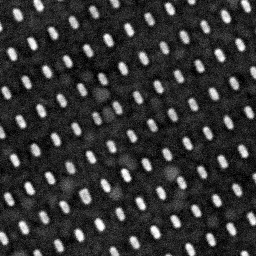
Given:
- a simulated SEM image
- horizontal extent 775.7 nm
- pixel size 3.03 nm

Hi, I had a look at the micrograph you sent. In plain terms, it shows a regular array of raised bodies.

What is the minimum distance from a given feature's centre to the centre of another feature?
69.3 nm